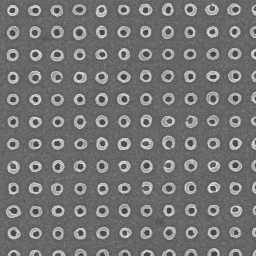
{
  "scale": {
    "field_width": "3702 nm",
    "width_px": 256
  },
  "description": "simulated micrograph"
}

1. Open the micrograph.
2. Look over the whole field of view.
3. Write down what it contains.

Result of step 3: a regular array of ring-shaped raised bodies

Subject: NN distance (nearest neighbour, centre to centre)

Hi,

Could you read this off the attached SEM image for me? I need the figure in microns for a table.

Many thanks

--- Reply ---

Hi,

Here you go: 0.306